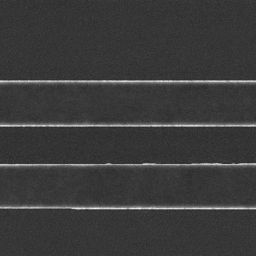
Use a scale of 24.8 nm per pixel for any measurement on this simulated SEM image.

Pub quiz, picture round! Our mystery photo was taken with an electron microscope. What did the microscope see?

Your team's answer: lines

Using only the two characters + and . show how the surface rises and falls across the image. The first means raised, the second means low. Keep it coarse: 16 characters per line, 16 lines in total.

................
................
................
................
................
++++++++++++++++
++++++++++++++++
++++++++++++++++
................
................
++++++++++++++++
++++++++++++++++
++++++++++++++++
................
................
................